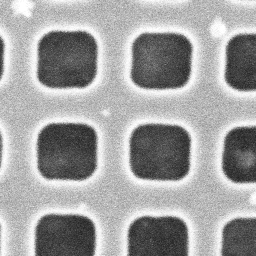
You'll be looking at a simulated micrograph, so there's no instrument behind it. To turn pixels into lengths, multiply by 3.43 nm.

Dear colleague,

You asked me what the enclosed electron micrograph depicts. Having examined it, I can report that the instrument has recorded holes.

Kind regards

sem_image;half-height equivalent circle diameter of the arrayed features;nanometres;224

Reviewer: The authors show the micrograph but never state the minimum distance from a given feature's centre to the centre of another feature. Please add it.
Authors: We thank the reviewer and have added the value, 315 nm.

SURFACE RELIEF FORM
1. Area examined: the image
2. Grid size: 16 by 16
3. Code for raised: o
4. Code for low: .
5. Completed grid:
oooooooooooooooo
oooooooooooooooo
oo....oo....oo..
oo....oo....oo..
oo....oo....oo..
ooo..oooo..ooo..
oooooooooooooooo
oooooooooooooooo
oo....oo....oo..
oo....oo....oo..
oo....oo....oo..
oooooooooooooooo
oooooooooooooooo
ooo..oooo.oooooo
oo....oo....oo..
oo....oo....oo..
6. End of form